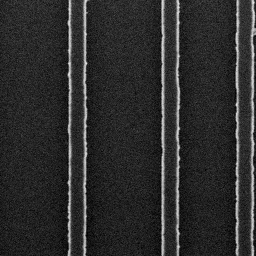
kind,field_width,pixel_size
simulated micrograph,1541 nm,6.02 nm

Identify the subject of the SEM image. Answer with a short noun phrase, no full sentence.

lines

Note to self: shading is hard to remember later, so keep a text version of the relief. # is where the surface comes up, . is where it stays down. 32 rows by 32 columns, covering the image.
.........##.........##........##
.........##.........##........##
.........##.........##........##
.........##.........##........##
.........##.........##........##
.........##.........##........##
.........##.........##........##
.........##.........##........##
.........##.........##........##
.........##.........##........##
.........##.........##........##
.........##.........##........##
.........##.........##........##
.........##.........##........##
.........##.........##........##
.........##.........##........##
.........##.........##........##
.........##.........##........##
.........##.........##........##
.........##.........##........##
.........##.........##........##
.........##.........##........##
.........##.........##........##
.........##.........##........##
.........##.........##........##
.........##.........##........##
.........##.........##........##
.........##.........##........##
.........##.........##........##
.........##.........##........##
.........##.........##........##
.........##.........##........##